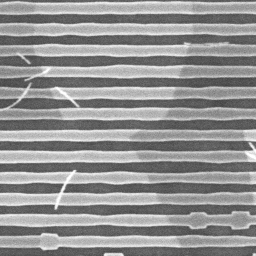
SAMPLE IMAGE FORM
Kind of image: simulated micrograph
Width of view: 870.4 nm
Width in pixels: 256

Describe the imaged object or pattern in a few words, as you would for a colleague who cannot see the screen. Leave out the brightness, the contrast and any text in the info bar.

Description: wiring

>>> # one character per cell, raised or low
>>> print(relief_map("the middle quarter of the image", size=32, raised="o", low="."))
............oooooo...........ooo
oooooooooooooooooooooooooooooooo
oooooooooooooooooooooooooooooooo
................................
................................
................................
oooooooooooooooooooooooooooooooo
oooooooooooooooooooooooooooooooo
ooooooo.....oooooooooooooooo....
................................
................................
oooooooooooooooooooooooooooooooo
oooooooooooooooooooooooooooooooo
oooooooooooooooooooooooooooooooo
................................
................................
................................
oooooooooooooooooooooooooooooooo
oooooooooooooooooooooooooooooooo
................................
................................
................................
oooooooooooooooooooooooooooooooo
oooooooooooooooooooooooooooooooo
................................
................................
................................
oooooo.oooooooooooooooo.......oo
oooooooooooooooooooooooooooooooo
ooooooooooooooooooooooooooo..ooo
................................
................................